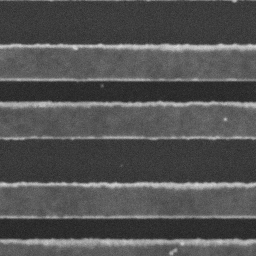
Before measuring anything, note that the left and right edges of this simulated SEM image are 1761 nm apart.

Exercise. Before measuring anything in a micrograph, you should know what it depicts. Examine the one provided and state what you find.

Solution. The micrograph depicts lines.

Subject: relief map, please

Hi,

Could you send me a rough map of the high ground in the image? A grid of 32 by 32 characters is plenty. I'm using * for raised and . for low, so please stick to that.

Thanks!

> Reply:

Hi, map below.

................................
................................
................................
................................
................................
................................
********************************
********************************
********************************
********************************
................................
................................
................................
********************************
********************************
********************************
********************************
................................
................................
................................
................................
................................
................................
********************************
********************************
********************************
********************************
................................
................................
................................
********************************
********************************